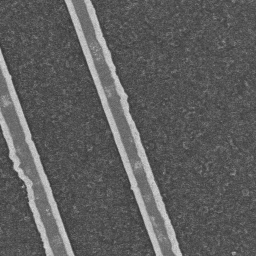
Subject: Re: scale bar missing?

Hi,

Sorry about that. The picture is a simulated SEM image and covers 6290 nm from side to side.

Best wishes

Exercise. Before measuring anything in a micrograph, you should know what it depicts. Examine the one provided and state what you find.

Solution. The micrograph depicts one or a few lines or trenches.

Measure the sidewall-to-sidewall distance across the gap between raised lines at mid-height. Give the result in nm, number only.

2030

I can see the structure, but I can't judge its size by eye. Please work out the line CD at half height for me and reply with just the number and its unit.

466 nanometres